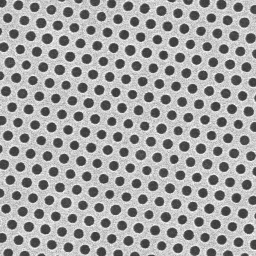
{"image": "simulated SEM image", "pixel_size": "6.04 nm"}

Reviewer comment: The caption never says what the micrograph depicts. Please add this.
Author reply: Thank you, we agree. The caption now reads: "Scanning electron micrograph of a regular array of holes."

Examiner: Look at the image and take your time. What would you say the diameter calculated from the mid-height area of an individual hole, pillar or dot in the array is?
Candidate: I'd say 60.9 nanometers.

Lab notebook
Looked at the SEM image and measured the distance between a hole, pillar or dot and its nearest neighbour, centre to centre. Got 99.9 nm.